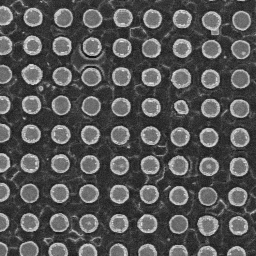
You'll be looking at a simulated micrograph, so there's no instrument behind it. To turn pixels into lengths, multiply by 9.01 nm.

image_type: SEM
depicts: a regular array of raised bodies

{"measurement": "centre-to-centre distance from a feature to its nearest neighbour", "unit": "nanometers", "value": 260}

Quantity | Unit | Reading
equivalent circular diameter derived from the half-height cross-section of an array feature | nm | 162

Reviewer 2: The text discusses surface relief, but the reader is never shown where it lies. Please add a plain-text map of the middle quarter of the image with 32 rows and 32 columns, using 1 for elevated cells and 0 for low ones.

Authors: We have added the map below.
00000000000000000000000000000000
10000011000001110000011000000100
11000111100011110000111100011110
11000111100011110000111100011111
10000111100001110000111100011111
00000000000000000000000000001110
00000000000000000000000000000000
00000000000000000000000000000000
10000011000000000000000000000000
10000111100011110000111100001100
10000111100011111000111100001110
10000111100011110000111100001110
00000011000001110000011000000000
00000000000000000000000000000000
00000000000000000000000000000000
00000000000000000000000000000000
10000111000011110000111000001100
10001111100011110001111100011110
10000111000011110000111100011110
10000111000001100000111000011110
00000000000000000000000000000000
00000000000000000000000000000000
00000000000000000000000000000000
10000111000001100000111000011100
10000111100011110001111100111110
10001111100011110001111100111110
10000111000011110000111000011110
00000000000000000000000000000100
00000000000000000000000000000000
00000000000000000000000000000000
00000110000001100000000000000000
10001111000011110001111000011100